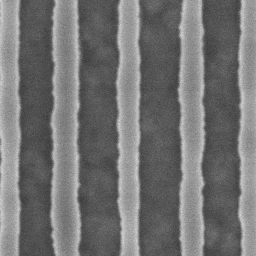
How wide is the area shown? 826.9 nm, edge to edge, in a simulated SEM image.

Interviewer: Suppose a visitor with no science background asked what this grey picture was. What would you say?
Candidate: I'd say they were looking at lines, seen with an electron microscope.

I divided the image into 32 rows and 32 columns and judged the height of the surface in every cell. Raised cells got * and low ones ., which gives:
**.....***.....**......**.....**
**.....***.....**......**.....**
**.....***.....**......**.....**
**.....***.....**......**.....**
**.....***.....**......**.....**
**.....***.....**......**.....**
**.....***.....**......**.....**
**.....***.....**......**.....**
**.....***.....**......**.....**
**.....***.....**......**.....**
**.....***.....**......**.....**
**.....***.....**.....***.....**
**.....***.....**......**.....**
**.....***.....**......**.....**
**.....***.....**......**.....**
**....****.....**......**.....**
**.....***.....**......**.....**
**.....***.....**......**.....**
**.....***.....**......**.....**
**.....***.....**......**.....**
**.....***.....**......**.....**
**.....***.....**......**.....**
**.....***.....**......**.....**
**.....***.....**......**.....**
**.....***.....**......**.....**
**.....***.....**......**.....**
**....****.....**......**.....**
**....****.....**......**.....**
**.....***.....**......**.....**
**.....***.....**......**.....**
**.....***.....**......**.....**
**.....***.....**......**.....**